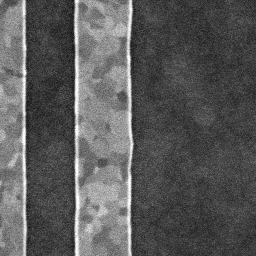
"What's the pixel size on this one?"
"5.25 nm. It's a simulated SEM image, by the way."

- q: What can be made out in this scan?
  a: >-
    one or a few lines or trenches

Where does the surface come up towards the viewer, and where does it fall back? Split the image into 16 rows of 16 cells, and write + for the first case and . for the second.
+....+++........
+....+++........
++...+++........
++...+++........
++...+++........
+....+++........
++...+++........
++...+++........
++...+++........
++...+++........
++...+++........
++...+++........
++...+++........
++...+++........
++...+++........
++...+++........